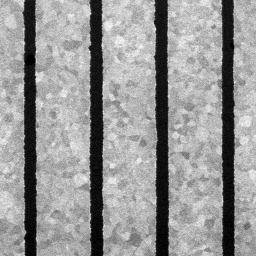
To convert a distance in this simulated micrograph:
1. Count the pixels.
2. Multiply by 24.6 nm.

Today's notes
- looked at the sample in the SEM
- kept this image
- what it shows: one or a few lines or trenches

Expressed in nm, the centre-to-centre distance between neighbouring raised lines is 1620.